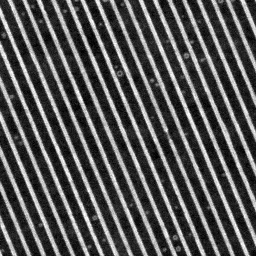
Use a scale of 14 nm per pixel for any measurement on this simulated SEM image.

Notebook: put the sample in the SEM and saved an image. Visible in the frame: parallel lines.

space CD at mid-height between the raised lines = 147 nanometres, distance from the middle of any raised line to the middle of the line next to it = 187 nm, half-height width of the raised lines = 2.89 px